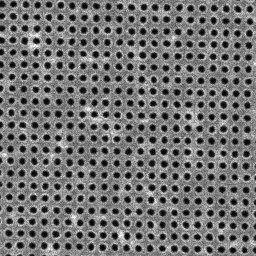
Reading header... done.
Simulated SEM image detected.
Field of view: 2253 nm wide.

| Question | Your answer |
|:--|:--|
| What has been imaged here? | a regular array of holes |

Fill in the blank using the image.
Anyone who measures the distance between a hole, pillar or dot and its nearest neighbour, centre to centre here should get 11.5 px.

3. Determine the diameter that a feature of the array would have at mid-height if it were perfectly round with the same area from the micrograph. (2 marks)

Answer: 0.0596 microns